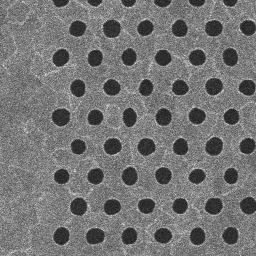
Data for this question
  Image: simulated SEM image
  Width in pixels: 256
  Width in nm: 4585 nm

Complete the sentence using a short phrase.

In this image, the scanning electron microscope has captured a regular array of holes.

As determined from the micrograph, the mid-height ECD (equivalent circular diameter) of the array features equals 304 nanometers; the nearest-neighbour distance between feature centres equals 0.6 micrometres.